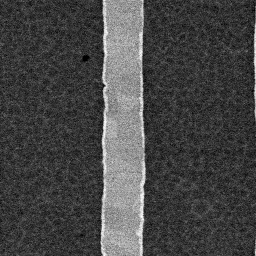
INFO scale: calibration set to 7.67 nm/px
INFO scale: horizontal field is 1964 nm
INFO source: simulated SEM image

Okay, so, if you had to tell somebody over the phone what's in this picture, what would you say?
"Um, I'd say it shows one or a few lines or trenches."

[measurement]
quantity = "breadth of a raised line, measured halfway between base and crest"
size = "0.309 micrometres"